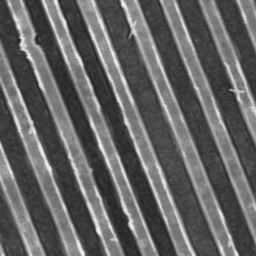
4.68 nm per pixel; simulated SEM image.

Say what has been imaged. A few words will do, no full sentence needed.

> parallel lines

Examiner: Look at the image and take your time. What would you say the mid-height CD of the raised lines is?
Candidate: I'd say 0.0735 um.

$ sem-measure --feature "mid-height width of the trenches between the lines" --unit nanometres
96.4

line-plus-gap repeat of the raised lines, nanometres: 168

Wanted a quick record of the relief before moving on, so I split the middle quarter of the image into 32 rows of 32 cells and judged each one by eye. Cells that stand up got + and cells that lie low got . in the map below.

.++++.....++++.......++++.....++
.++++.....++++.......++++......+
..++++....+++++......++++......+
..++++.....++++.......++++......
..++++.....++++.......++++......
...++++.....++++......+++++.....
...++++.....++++.......++++.....
...+++++....+++++......++++.....
....++++.....++++.......++++....
....+++++.....+++.......++++....
.....++++.....++++......+++++...
+....++++.....++++.......++++...
+....+++++.....++++.......+++...
+.....++++.....++++.......++++..
++....++++.....++++.......++++..
++.....++++.....++++.......++++.
+++....++++.....++++.......++++.
+++....++++.....+++++......++++.
+++.....++++.....++++.......++++
++++....++++.....++++........+++
++++.....++++.....++++.......+++
+++++....++++.....++++.......+++
.++++.....+++.....+++++......+++
.+++++....++++.....++++.......++
..++++....++++.....++++.......++
..++++.....++++.....++++......++
..+++++....++++.....++++.......+
...++++....+++++....+++++......+
...++++.....++++.....++++.......
...+++++....++++.....++++.......
....++++.....++++.....++++......
....++++.....++++.....++++......